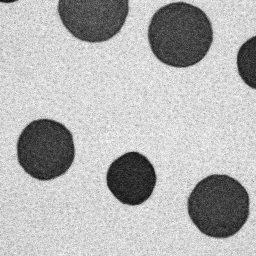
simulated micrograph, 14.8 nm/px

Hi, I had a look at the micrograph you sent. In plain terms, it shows holes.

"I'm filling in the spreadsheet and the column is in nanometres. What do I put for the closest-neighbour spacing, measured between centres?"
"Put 1350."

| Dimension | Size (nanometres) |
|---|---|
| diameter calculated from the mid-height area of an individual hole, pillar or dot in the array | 900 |